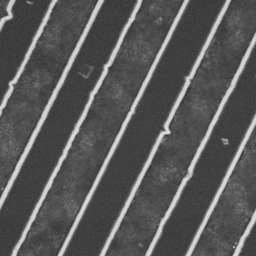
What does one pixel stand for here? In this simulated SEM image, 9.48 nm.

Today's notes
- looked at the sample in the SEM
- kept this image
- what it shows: one or a few lines or trenches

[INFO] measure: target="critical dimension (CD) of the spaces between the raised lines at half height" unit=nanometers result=380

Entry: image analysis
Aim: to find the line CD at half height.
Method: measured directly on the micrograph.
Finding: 353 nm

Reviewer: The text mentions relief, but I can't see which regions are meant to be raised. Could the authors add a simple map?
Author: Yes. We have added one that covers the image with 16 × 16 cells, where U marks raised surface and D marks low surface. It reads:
DUUDDDUUUDDUUUDD
UUUDDDUUDDDUUUDD
UUDDDUUUDDUUUDDD
UUDDDUUDDDUUUDDU
UDDDUUUDDUUUDDDU
UDDDUUDDDUUUDDUU
DDDUUUDDUUUDDDUU
DDDUUDDDUUUDDUUU
DDUUUDDUUUDDDUUD
DDUUDDDUUUDDUUUD
DUUUDDUUUDDDUUDD
DUUDDDUUUDDUUUDD
UUUDDUUUDDDUUDDD
UUDDDUUUDDUUUDDD
UUDDUUUDDDUUDDDU
UDDDUUUDDUUUDDDU